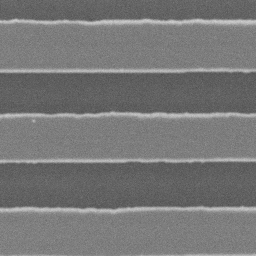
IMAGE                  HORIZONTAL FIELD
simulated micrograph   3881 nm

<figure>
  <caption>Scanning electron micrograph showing lines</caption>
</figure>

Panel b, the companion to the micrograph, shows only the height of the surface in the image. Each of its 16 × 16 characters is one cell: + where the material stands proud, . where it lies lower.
................
++++++++++++++++
++++++++++++++++
++++++++++++++++
................
................
................
++++++++++++++++
++++++++++++++++
++++++++++++++++
................
................
................
++++++++++++++++
++++++++++++++++
++++++++++++++++